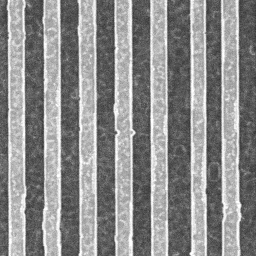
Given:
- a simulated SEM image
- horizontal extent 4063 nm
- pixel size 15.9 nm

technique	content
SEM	parallel lines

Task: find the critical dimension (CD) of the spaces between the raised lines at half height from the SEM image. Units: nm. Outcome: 331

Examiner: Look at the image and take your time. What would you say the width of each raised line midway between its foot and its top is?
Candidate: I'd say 0.236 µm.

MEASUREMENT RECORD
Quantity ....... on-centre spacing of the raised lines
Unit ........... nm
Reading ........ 565